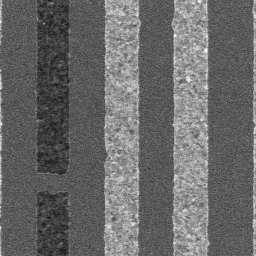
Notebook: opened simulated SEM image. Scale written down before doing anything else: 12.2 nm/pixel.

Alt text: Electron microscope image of one or a few lines or trenches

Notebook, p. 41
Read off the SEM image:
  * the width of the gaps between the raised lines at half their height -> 440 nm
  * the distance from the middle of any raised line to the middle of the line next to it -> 0.84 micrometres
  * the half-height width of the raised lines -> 0.402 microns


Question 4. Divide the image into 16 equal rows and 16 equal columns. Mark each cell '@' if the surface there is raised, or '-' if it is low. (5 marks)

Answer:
--@@---@@--@@---
--@@---@@--@@---
--@@---@@--@@---
--@@---@@--@@---
--@@---@@--@@---
--@@---@@--@@---
--@@---@@--@@---
--@@---@@--@@---
--@@---@@--@@---
--@@---@@--@@---
--@@---@@--@@---
-------@@--@@---
--@@---@@--@@---
--@@---@@--@@---
--@@---@@--@@---
--@@---@@--@@---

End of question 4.